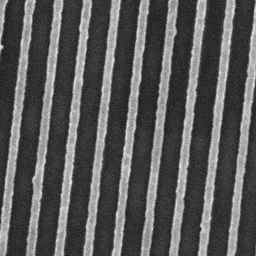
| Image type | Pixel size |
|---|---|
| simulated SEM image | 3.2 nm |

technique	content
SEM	parallel lines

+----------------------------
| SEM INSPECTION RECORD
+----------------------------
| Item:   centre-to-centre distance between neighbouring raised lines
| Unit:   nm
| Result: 91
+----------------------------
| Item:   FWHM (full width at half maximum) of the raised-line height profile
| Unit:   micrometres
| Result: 0.025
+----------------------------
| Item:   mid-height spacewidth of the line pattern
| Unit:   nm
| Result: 67.1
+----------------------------